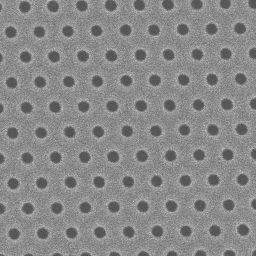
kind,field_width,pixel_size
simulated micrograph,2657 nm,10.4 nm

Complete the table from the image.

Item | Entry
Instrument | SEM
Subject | a regular array of holes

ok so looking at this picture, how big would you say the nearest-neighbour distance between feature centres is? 0.296 microns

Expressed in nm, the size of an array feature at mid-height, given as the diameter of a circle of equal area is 125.